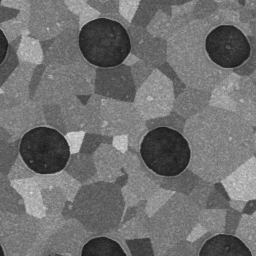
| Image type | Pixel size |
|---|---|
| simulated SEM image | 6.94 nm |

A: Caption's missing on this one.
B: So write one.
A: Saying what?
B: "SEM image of holes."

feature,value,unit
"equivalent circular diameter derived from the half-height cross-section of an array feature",346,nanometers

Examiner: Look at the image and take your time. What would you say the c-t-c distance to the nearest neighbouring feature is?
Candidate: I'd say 843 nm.